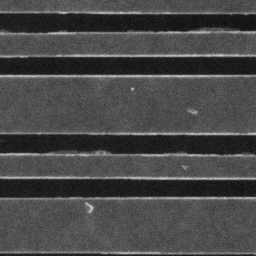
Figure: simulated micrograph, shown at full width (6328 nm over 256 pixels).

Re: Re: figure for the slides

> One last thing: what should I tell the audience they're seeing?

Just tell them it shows lines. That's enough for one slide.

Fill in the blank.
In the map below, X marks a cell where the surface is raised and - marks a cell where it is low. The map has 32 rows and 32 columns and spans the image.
XXXXXXXXXXXXXXXXXXXXXXXXXXXXXXXX
XXXXXXXXXXXXXXXXXXXXXXXXXXXXXXXX
--------------------------------
--------------------------------
XXXXXXXXXXXXXXXXXXXXXXXXXXXXXXXX
XXXXXXXXXXXXXXXXXXXXXXXXXXXXXXXX
XXXXXXXXXXXXXXXXXXXXXXXXXXXXXXXX
--------------------------------
--------------------------------
XXXXXXXXXXXXXXXXXXXXXXXXXXXXXXXX
XXXXXXXXXXXXXXXXXXXXXXXXXXXXXXXX
XXXXXXXXXXXXXXXXXXXXXXXXXXXXXXXX
XXXXXXXXXXXXXXXXXXXXXXXXXXXXXXXX
XXXXXXXXXXXXXXXXXXXXXXXXXXXXXXXX
XXXXXXXXXXXXXXXXXXXXXXXXXXXXXXXX
XXXXXXXXXXXXXXXXXXXXXXXXXXXXXXXX
XXXXXXXXXXXXXXXXXXXXXXXXXXXXXXXX
--------------------------------
--------------------------------
XXXXXXXXXXXXXXXXXXXXXXXXXXXXXXXX
XXXXXXXXXXXXXXXXXXXXXXXXXXXXXXXX
XXXXXXXXXXXXXXXXXXXXXXXXXXXXXXXX
--------------------------------
--------------------------------
--------------------------------
XXXXXXXXXXXXXXXXXXXXXXXXXXXXXXXX
XXXXXXXXXXXXXXXXXXXXXXXXXXXXXXXX
XXXXXXXXXXXXXXXXXXXXXXXXXXXXXXXX
XXXXXXXXXXXXXXXXXXXXXXXXXXXXXXXX
XXXXXXXXXXXXXXXXXXXXXXXXXXXXXXXX
XXXXXXXXXXXXXXXXXXXXXXXXXXXXXXXX
XXXXXXXXXXXXXXXXXXXXXXXXXXXXXXXX